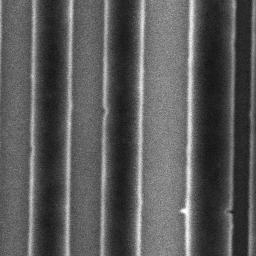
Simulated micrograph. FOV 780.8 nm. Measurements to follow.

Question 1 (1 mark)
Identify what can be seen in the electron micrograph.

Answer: one or a few lines or trenches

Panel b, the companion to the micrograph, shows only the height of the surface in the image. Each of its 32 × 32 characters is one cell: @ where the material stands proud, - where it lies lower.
----@@@@@----@@@@@------@@@@@---
----@@@@@----@@@@@------@@@@@---
----@@@@@----@@@@@------@@@@@---
----@@@@@----@@@@@------@@@@@---
----@@@@@----@@@@@------@@@@@---
----@@@@@----@@@@@------@@@@@---
----@@@@@----@@@@@------@@@@@---
----@@@@@----@@@@@------@@@@@---
----@@@@@----@@@@@------@@@@@---
----@@@@@----@@@@@------@@@@@---
----@@@@@----@@@@@------@@@@@---
----@@@@@----@@@@@------@@@@@--@
----@@@@@----@@@@@------@@@@@--@
----@@@@@----@@@@@------@@@@@--@
----@@@@@----@@@@@------@@@@@--@
----@@@@@----@@@@@------@@@@@--@
----@@@@@----@@@@@------@@@@@--@
----@@@@@----@@@@@------@@@@@--@
----@@@@@----@@@@@------@@@@@--@
----@@@@@----@@@@@------@@@@@--@
----@@@@@----@@@@@------@@@@@--@
----@@@@@----@@@@@------@@@@@--@
----@@@@@----@@@@-------@@@@@--@
----@@@@@----@@@@------@@@@@@--@
----@@@@@----@@@@@-----@@@@@@--@
----@@@@@----@@@@@-----@@@@@@--@
----@@@@@----@@@@------@@@@@@--@
----@@@@-----@@@@------@@@@@@--@
----@@@@-----@@@@------@@@@@@--@
----@@@@-----@@@@------@@@@@@--@
----@@@@@----@@@@------@@@@@@--@
----@@@@@----@@@@------@@@@@@--@